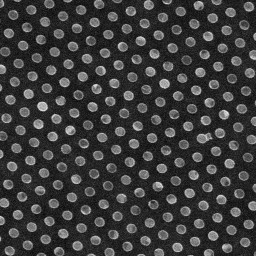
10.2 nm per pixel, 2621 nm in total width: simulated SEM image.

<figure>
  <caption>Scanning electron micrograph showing a regular array of raised bodies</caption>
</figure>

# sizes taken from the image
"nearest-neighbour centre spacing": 188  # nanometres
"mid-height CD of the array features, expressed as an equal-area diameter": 95.3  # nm